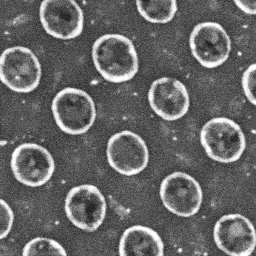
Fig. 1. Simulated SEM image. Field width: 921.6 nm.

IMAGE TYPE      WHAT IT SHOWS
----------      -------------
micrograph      a regular array of raised bodies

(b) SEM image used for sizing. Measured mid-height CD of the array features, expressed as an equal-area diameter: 146 nanometres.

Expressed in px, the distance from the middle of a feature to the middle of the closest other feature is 67.5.